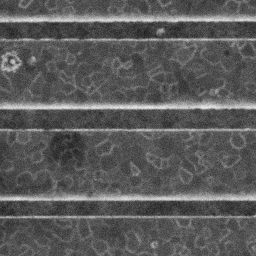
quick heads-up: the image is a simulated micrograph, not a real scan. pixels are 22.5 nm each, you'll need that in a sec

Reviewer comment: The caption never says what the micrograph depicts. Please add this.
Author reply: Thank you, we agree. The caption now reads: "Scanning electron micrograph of lines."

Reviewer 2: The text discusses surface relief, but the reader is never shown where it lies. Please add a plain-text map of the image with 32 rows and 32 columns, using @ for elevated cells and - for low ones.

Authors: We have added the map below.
@@@@@@@@@@@@@@@@@@@@@@@@@@@@@@@@
@@@@@@@@@@@@@@@@@@@@@@@@@@@@@@@@
--------------------------------
--------------------------------
--------------------------------
@@@@@@@@@@@@@@@@@@@@@@@@@@@@@@@@
@@@@@@@@@@@@@@@@@@@@@@@@@@@@@@@@
@@@@@@@@@@@@@@@@@@@@@@@@@@@@@@@@
@@@@@@@@@@@@@@@@@@@@@@@@@@@@@@@@
@@@@@@@@@@@@@@@@@@@@@@@@@@@@@@@@
@@@@@@@@@@@@@@@@@@@@@@@@@@@@@@@@
@@@@@@@@@@@@@@@@@@@@@@@@@@@@@@@@
@@@@@@@@@@@@@@@@@@@@@@@@@@@@@@@@
--------------------------------
--------------------------------
--------------------------------
@@@@@@@@@@@@@@@@@@@@@@@@@@@@@@@@
@@@@@@@@@@@@@@@@@@@@@@@@@@@@@@@@
@@@@@@@@@@@@@@@@@@@@@@@@@@@@@@@@
@@@@@@@@@@@@@@@@@@@@@@@@@@@@@@@@
@@@@@@@@@@@@@@@@@@@@@@@@@@@@@@@@
@@@@@@@@@@@@@@@@@@@@@@@@@@@@@@@@
@@@@@@@@@@@@@@@@@@@@@@@@@@@@@@@@
@@@@@@@@@@@@@@@@@@@@@@@@@@@@@@@@
@@@@@@@@@@@@@@@@@@@@@@@@@@@@@@@@
--------------------------------
--------------------------------
@@@@@@@@@@@@@@@@@@@@@@@@@@@@@@@@
@@@@@@@@@@@@@@@@@@@@@@@@@@@@@@@@
@@@@@@@@@@@@@@@@@@@@@@@@@@@@@@@@
@@@@@@@@@@@@@@@@@@@@@@@@@@@@@@@@
@@@@@@@@@@@@@@@@@@@@@@@@@@@@@@@@